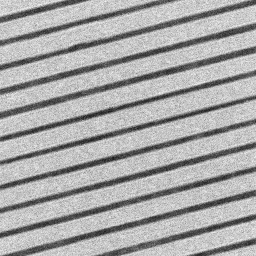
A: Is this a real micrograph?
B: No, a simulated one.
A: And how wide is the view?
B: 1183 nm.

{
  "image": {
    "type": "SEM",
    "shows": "parallel lines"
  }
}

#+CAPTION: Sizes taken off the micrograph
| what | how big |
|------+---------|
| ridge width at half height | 15.5 px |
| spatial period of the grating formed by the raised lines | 0.107 µm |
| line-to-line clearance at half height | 35.8 nm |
